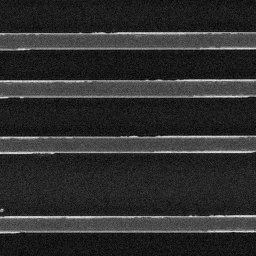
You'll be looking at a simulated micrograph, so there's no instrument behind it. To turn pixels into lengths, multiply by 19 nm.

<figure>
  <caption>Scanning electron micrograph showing lines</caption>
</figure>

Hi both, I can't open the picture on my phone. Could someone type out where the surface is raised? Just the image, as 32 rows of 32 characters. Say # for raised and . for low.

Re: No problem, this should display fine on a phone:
................................
................................
................................
................................
################################
################################
................................
................................
................................
................................
################################
################################
................................
................................
................................
................................
................................
################################
################################
................................
................................
................................
................................
................................
................................
................................
................................
################################
################################
................................
................................
................................